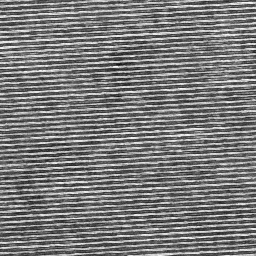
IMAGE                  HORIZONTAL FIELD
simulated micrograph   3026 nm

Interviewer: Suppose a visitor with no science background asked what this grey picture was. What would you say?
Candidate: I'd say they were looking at parallel lines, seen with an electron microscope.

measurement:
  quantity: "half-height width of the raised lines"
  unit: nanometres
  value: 16.2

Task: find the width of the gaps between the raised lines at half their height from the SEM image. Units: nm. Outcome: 42.8